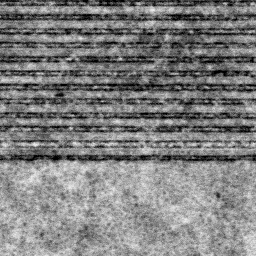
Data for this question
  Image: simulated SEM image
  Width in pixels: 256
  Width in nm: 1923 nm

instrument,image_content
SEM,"parallel lines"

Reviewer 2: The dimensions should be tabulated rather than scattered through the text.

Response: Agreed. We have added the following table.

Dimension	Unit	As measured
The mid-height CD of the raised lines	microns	0.0507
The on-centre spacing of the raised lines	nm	106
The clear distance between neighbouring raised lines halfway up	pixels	6.75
